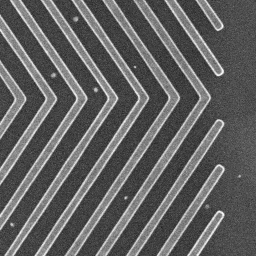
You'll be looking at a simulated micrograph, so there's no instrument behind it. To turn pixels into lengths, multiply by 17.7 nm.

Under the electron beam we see groups of lines, slits or small figures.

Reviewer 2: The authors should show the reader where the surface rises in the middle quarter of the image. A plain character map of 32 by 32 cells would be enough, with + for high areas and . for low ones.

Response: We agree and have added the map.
......++......++.....+++.....++.
+.....+++.....++......++.....+++
++.....++......++.....+++.....++
++......++......++.....+++.....+
.++.....+++.....++......++......
.+++.....++......++......++.....
..++......++......++.....+++....
...++......++.....+++.....++....
...++......++......++.....+++...
...++......++.....+++.....++....
..+++.....++......++.....+++....
.+++.....+++.....++......++.....
.++......++.....+++.....++......
+++.....++......++.....+++.....+
++......++.....++......++.....++
+......++.....+++.....++.....+++
+.....++......++.....+++.....++.
.....+++.....++......++.....+++.
.....++.....+++.....+++.....++..
....++......++.....+++.....++...
...+++.....++.....+++.....+++...
...++.....+++.....++.....+++....
..++......++.....+++.....++.....
.+++.....++......++.....+++.....
.++.....+++.....++.....+++.....+
+++.....++.....+++.....++......+
++.....++......++.....+++.....++
+.....+++.....++......++.....+++
......++.....+++.....++......++.
.....++......++.....+++.....++..
....+++.....++......++.....+++..
....++.....+++.....++......++...